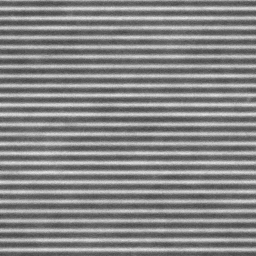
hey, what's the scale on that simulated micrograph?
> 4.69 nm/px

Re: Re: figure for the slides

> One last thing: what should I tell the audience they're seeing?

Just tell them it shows parallel lines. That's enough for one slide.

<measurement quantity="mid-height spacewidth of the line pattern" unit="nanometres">37.5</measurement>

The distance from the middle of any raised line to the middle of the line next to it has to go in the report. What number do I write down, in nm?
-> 45.2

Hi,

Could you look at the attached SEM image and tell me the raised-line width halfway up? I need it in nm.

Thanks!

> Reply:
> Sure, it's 8.2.